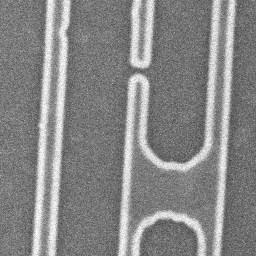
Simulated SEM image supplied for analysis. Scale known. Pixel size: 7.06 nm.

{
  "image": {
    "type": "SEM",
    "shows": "one or a few lines or trenches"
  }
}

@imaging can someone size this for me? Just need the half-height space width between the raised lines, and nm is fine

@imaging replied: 494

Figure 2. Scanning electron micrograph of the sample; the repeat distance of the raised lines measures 580 nm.